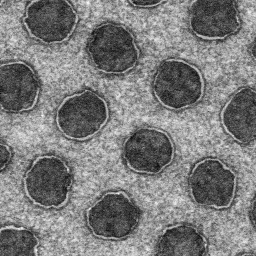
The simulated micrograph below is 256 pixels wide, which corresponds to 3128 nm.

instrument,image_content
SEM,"raised bodies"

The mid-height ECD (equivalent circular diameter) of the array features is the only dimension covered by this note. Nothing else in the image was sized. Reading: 588 nanometers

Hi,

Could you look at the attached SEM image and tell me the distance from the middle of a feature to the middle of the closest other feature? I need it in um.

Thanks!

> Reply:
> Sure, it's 0.893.